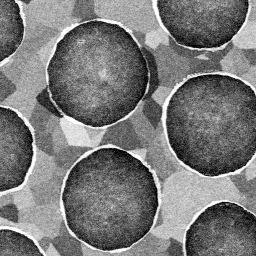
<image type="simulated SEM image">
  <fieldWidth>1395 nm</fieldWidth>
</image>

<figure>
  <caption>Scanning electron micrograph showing holes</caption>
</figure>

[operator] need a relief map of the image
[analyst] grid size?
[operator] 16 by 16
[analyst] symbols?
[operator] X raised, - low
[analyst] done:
-XXXXXXXXX------
-XXXX--XXX-----X
-XXX----XXX---XX
-XX------XXXXXXX
XXX------XXXXXXX
XXX------XX-----
XXXX-----X------
-XXXX---XX------
--XXXXXXXX------
--XXXX--XXX-----
--XXX----XXX---X
-XXX------XXXXXX
XXXX------XXXXXX
XXXX------XX----
-XXX-----XXX----
--XXXX--XXXX----